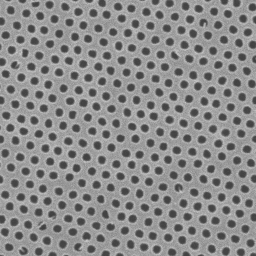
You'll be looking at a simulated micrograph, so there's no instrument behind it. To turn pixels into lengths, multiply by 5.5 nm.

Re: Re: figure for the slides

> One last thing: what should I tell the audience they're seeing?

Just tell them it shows a regular array of holes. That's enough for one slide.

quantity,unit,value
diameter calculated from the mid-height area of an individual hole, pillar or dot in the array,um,0.0456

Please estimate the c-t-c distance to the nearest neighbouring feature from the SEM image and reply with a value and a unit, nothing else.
0.0745 micrometres